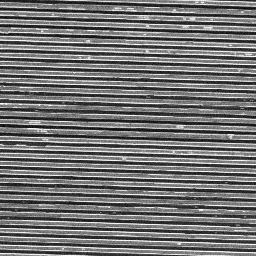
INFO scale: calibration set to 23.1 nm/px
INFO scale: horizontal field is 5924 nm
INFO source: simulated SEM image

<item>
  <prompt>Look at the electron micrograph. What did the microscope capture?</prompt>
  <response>parallel lines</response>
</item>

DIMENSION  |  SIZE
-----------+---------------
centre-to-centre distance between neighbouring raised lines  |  193 nm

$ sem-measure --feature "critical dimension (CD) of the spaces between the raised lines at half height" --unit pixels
3.75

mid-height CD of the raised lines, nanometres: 107